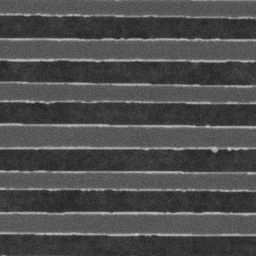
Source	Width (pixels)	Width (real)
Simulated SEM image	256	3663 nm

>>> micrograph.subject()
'lines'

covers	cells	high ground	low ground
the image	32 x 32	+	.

++++++++++++++++++++++++++++++++
++++++++++++++++++++++++++++++++
................................
................................
................................
++++++++++++++++++++++++++++++++
++++++++++++++++++++++++++++++++
.++++++.++++++++++++++++++++++++
................................
................................
+++++++++++.....................
++++++++++++++++++++++++++++++++
++++++++++++++++++++++++++++++++
................................
................................
................................
++++++++++++++++++++++++++++++++
++++++++++++++++++++++++++++++++
++++++++++++++++++++++++++++++++
................................
................................
+++..+..........................
++++++++++++++++++++++++++++++++
++++++++++++++++++++++++++++++++
................................
................................
................................
++++++++++++++++++++++++++++++++
++++++++++++++++++++++++++++++++
................................
................................
................................